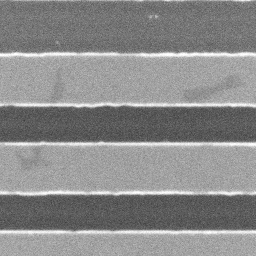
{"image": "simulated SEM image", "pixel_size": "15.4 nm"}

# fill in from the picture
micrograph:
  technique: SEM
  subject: lines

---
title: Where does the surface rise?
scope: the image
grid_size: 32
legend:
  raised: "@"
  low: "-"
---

--------------------------------
--------------------------------
--------------------------------
--------------------------------
--------------------------------
--------------------------------
--------------------------------
@@@@@@@@@@@@@@@@@@@@@@@@@@@@@@@@
@@@@@@@@@@@@@@@@@@@@@@@@@@@@@@@@
@@@@@@@@@@@@@@@@@@@@@@@@@@@@@@@@
@@@@@@@@@@@@@@@@@@@@@@@@@@@@@@@@
@@@@@@@@@@@@@@@@@@@@@@@@@@@@@@@@
@@@@@@@@@@@@@@@@@@@@@@@@@@@@@@@@
--------------------------------
--------------------------------
--------------------------------
--------------------------------
--------------------------------
@@@@@@@@@@@@@@@@@@@@@@@@@@@@@@@@
@@@@@@@@@@@@@@@@@@@@@@@@@@@@@@@@
@@@@@@@@@@@@@@@@@@@@@@@@@@@@@@@@
@@@@@@@@@@@@@@@@@@@@@@@@@@@@@@@@
@@@@@@@@@@@@@@@@@@@@@@@@@@@@@@@@
@@@@@@@@@@@@@@@@@@@@@@@@@@@@@@@@
--------------------------------
--------------------------------
--------------------------------
--------------------------------
--------------------------------
@@@@@@@@@@@@@@@@@@@@@@@@@@@@@@@@
@@@@@@@@@@@@@@@@@@@@@@@@@@@@@@@@
@@@@@@@@@@@@@@@@@@@@@@@@@@@@@@@@